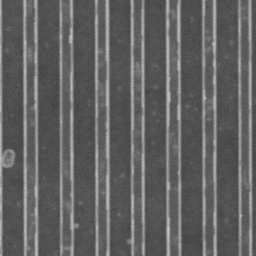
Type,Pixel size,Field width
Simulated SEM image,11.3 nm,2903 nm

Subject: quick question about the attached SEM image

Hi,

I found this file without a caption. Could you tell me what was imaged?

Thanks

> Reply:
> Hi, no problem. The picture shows parallel lines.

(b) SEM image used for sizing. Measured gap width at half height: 264 nanometers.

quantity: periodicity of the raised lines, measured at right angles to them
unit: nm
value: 405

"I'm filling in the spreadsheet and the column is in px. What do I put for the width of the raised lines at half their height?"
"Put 12.5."